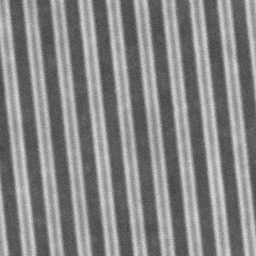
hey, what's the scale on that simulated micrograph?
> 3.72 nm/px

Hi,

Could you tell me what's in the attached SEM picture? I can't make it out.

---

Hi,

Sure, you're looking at parallel lines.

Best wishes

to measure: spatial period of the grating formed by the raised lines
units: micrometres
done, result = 0.103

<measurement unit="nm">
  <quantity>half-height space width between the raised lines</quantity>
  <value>61.4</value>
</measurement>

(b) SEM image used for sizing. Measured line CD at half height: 40.6 nm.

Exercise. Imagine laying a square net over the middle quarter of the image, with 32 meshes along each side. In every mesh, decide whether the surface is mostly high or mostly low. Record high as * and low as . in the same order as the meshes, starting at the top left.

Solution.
*.....**.....**.....**.....**...
**....**.....**.....**.....**...
**....***....**.....**.....**...
**....***....***....***....**...
**....***....***....***....***..
**....***....***....***....***..
**....***....***....***....***..
**.....**....***....***....***..
**.....**.....**....***....***..
**.....**.....**.....**....***..
***....**.....**.....**.....**..
***....***....**.....**.....**..
***....***....***....**.....**..
***....***....***....***....**..
***....***....***....***....***.
.**....***....***....***....***.
***.....**....***....***....***.
.**.....**.....**....***.....**.
.**.....**.....**.....**.....**.
.***....**.....**.....**.....**.
.**.....***....**.....**.....**.
.***....***....***....**.....**.
.***....***....***....***....**.
.***....***....***....***....***
..**....***....***....***....***
..**.....**....***....***....***
..**.....**.....**....***....***
..**.....**.....**.....**....***
..***....**.....**.....**.....**
..**.....***....**.....**.....**
..***....***....***....**.....**
..***....***....***....***....**